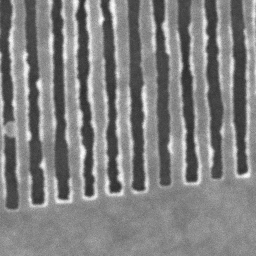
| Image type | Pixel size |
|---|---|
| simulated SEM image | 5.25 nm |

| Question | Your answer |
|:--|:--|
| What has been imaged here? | parallel lines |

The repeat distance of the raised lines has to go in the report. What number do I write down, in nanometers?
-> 136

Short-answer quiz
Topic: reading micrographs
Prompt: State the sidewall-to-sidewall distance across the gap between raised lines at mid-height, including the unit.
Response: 60.3 nm